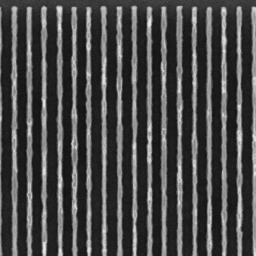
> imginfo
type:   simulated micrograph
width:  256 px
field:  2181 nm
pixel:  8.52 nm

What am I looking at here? parallel lines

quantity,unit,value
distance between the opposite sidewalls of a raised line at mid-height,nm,41.6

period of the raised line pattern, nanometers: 128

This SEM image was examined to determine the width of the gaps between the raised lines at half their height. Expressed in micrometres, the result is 0.0916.